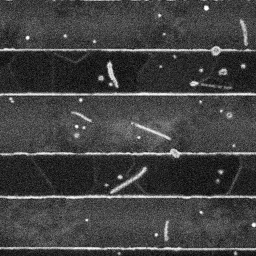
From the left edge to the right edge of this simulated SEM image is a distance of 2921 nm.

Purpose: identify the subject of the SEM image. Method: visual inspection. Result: lines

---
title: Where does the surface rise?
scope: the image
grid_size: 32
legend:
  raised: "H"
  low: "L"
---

LLLLLLLLLLLLLLLLLLLLLLLLLLLLLLLL
LLLLLLLLLLLLLLLLLLLLLLLLLLLLLLLL
LLLLLLLLLLLLLLLLLLLLLLLLLLLLLLLL
LLLLLLLLLLLLLLLLLLLLLLLLLLLLLLLL
LLLLLLLLLLLLLLLLLLLLLLLLLLLLLLLL
LLLLLLLLLLLLLLLLLLLLLLLLLLLLLLLL
HHHHHHHHHHHHHHHHHHHHHHHHHHHHHHHH
HHHHHHHHHHHHHHHHHHHHHHHHHHHHHHHH
HHHHHHHHHHHHHHHHHHHHHHHHHHHHHHHH
HHHHHHHHHHHHHHHHHHHHHHHHHHHHHHHH
HHHHHHHHHHHHHHHHHHHHHHHHHHHHHHHH
HHHHHHHHHHHHHHHHHHHHHHHHHHHHHHHH
LLLLLLLLLLLLLLLLLLLLLLLLLLLLLLLL
LLLLLLLLLLLLLLLLLLLLLLLLLLLLLLLL
LLLLLLLLLLLLLLLLLLLLLLLLLLLLLLLL
LLLLLLLLLLLLLLLLLLLLLLLLLLLLLLLL
LLLLLLLLLLLLLLLLLLLLLLLLLLLLLLLL
LLLLLLLLLLLLLLLLLLLLLLLLLLLLLLLL
LLLLLLLLLLLLLLLLLLLLLLLLLLLLLLLL
HHHHHHHHHHHHHHHHHHHHHHHHHHHHHHHH
HHHHHHHHHHHHHHHHHHHHHHHHHHHHHHHH
HHHHHHHHHHHHHHHHHHHHHHHHHHHHHHHH
HHHHHHHHHHHHHHHHHHHHHHHHHHHHHHHH
HHHHHHHHHHHHHHHHHHHHHHHHHHHHHHHH
HHHHHHHHHHHHHHHHHHHHHHHHHHHHHHHH
LLLLLLLLLLLLLLLLLLLLLLLLLLLLLLLL
LLLLLLLLLLLLLLLLLLLLLLLLLLLLLLLL
LLLLLLLLLLLLLLLLLLLLLLLLLLLLLLLL
LLLLLLLLLLLLLLLLLLLLLLLLLLLLLLLL
LLLLLLLLLLLLLLLLLLLLLLLLLLLLLLLL
LLLLLLLLLLLLLLLLLLLLLLLLLLLLLLLL
HHHHHHHHHHHHHHHHHHHHHHHHHHHHHHHH